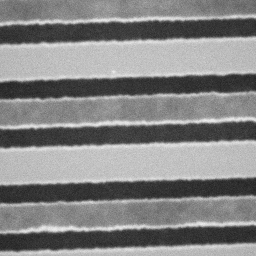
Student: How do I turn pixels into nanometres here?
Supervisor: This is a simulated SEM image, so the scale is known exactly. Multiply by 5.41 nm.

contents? lines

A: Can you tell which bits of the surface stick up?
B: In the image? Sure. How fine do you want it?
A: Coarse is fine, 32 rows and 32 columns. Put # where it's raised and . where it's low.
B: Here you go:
################################
################################
##################..............
................................
................................
.....#.#########################
################################
################################
################################
#####################...........
................................
................................
..##############################
################################
################################
####################............
................................
................................
...#############################
################################
################################
################################
######################..........
................................
...............................#
#..#############################
################################
################################
####################............
................................
................................
################################